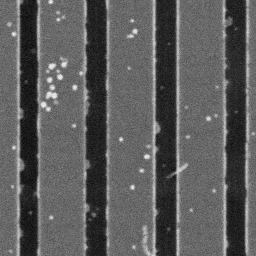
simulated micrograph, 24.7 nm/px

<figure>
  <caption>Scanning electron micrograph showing lines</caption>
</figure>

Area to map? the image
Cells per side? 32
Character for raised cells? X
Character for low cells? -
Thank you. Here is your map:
XX---XXXXXX--XXXXXX---XXXXXX---X
XX---XXXXXX--XXXXXX---XXXXXX---X
XX---XXXXXX--XXXXXX---XXXXXX---X
XX---XXXXXX--XXXXXX---XXXXXX---X
XX---XXXXXX--XXXXXX---XXXXXX---X
XX---XXXXXX--XXXXXX---XXXXXX---X
XX---XXXXXX--XXXXXX---XXXXXX---X
XX---XXXXXX--XXXXXX---XXXXXX---X
XX---XXXXXX--XXXXXX---XXXXXX---X
XX---XXXXXX--XXXXXX---XXXXXX---X
XX---XXXXXX--XXXXXX---XXXXXX---X
XX---XXXXXX--XXXXXX---XXXXXX---X
XX---XXXXXX--XXXXXX---XXXXXX---X
XX---XXXXXX--XXXXXX---XXXXXX---X
XX---XXXXXX--XXXXXX---XXXXXX---X
XX---XXXXXX--XXXXXX---XXXXXX---X
XX---XXXXXX--XXXXXX---XXXXXX---X
XX---XXXXXX--XXXXXX---XXXXXX---X
XX---XXXXXX--XXXXXX---XXXXXX---X
XX---XXXXXX--XXXXXX---XXXXXX---X
XX---XXXXXX--XXXXXX---XXXXXX---X
XX---XXXXXX--XXXXXX---XXXXXX---X
XX---XXXXXX--XXXXXX---XXXXXX---X
XX---XXXXXX--XXXXXX---XXXXXX---X
XX---XXXXXX--XXXXXX---XXXXXX---X
XX---XXXXXX--XXXXXX---XXXXXX---X
XX---XXXXXX--XXXXXX---XXXXXX---X
XX---XXXXXX--XXXXXX---XXXXXX---X
XX---XXXXXX--XXXXXX---XXXXXX---X
XX---XXXXXX--XXXXXX---XXXXXX---X
XX---XXXXXX--XXXXXX---XXXXXX---X
XX---XXXXXX--XXXXXX---XXXXXX---X